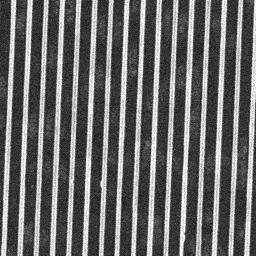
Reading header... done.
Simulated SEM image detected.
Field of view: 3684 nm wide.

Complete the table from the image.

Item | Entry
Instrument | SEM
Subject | parallel lines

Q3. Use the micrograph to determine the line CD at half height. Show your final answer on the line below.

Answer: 53.9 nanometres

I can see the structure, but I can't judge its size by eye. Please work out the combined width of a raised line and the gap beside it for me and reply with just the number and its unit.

233 nanometres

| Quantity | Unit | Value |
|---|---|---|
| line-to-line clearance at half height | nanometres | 172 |